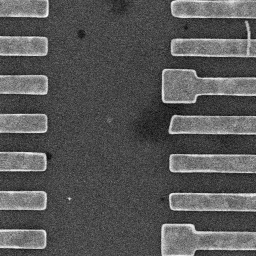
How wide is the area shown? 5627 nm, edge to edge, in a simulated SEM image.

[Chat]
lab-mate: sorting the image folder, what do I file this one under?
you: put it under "wiring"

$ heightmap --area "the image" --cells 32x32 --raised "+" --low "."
++++++................++++++++++
++++++................++++++++++
................................
................................
................................
++++++................++++++++++
++++++................++++++++++
................................
................................
....................+++++.......
++++++..............++++++++++++
.++++...............++++++++++++
.....................+++........
................................
++++++..........................
++++++...............+++++++++++
......................++++++++++
................................
................................
+++++.................+++.++++++
++++++...............+++++++++++
............................++++
................................
................................
++++++...............+++++++++++
++++++...............+++++++++++
................................
................................
....................++++........
++++++..............++++++++++++
++++++..............++++++++++++
....................++++........